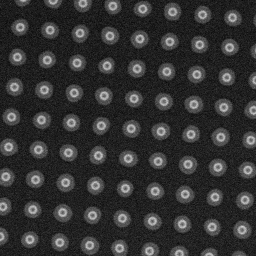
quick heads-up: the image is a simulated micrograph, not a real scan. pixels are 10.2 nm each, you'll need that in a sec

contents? an array of small figures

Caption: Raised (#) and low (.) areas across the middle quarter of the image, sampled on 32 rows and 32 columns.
.####....###....####....###.....
..##.....###....####....####...#
................####....####...#
........................###....#
................................
.###............................
.####...###.....................
.####...####....###.....##......
.###....####...#####...####....#
.........###....###....####...##
................###....####...##
...............................#
................................
####.....#......................
####....###.....##..............
####...####....####...####.....#
.##....####....####...####....##
........##.....####...####....##
.......................###....##
...............................#
##..............................
###....###......................
###....###....####....###.......
###...####....####...####.....##
.......###....####...#####...###
...............##.....###....###
.............................###
................................
##.....##.......................
###...####....##................
###...####...####....###........
##....####...####....####...####